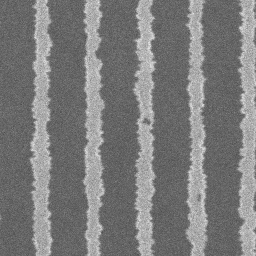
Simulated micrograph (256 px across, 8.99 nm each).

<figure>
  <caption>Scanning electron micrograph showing parallel lines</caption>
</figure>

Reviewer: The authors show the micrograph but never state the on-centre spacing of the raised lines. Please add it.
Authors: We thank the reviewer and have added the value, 0.465 µm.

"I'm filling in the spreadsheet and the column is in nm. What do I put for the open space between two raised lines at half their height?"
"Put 344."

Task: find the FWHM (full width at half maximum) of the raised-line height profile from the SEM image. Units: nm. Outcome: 119